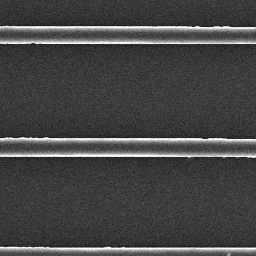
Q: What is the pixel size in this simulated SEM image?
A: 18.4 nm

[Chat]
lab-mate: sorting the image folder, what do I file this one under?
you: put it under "lines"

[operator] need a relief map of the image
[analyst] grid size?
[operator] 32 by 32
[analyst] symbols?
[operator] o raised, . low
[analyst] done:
................................
................................
................................
oooooooooooooooooooooooooooooooo
oooooooooooooooooooooooooooooooo
................................
................................
................................
................................
................................
................................
................................
................................
................................
................................
................................
................................
oooooooooooooooooooooooooooooooo
oooooooooooooooooooooooooooooooo
oooooooooooooooooooooooooooooooo
................................
................................
................................
................................
................................
................................
................................
................................
................................
................................
................................
oooooooooooooooooooooooooooooooo